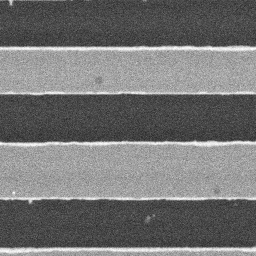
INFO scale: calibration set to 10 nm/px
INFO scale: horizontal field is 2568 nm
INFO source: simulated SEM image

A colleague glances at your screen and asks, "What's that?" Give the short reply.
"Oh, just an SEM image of lines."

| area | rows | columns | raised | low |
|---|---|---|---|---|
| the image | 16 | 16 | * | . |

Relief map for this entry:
................
................
................
****************
****************
****************
................
................
................
****************
****************
****************
................
................
................
................